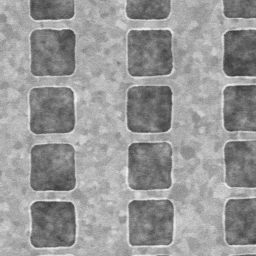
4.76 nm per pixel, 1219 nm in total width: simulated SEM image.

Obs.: a regular array of holes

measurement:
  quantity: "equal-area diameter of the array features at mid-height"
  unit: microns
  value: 0.245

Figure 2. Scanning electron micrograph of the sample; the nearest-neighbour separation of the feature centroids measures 270 nm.